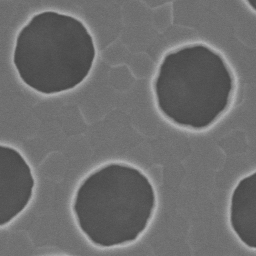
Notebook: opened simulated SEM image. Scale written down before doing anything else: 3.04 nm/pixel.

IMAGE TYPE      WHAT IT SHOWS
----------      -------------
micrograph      holes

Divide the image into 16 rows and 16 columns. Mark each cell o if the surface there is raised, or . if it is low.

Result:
oooooooooooooooo
oo...ooooooooooo
o.....oooooooooo
o.....oooo....oo
o.....oooo....oo
oo..oooooo.....o
oooooooooo....oo
ooooooooooo..ooo
oooooooooooooooo
.ooooooooooooooo
..oooo..oooooooo
..ooo....oooooo.
..ooo.....oooo..
.oooo....ooooo..
ooooo....oooooo.
oooooooooooooooo